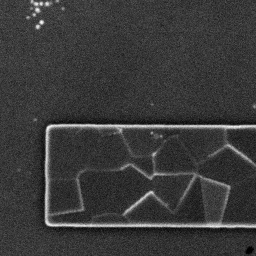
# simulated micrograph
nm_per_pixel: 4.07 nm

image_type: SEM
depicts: wiring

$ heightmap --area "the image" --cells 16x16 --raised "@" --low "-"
----------------
----------------
----------------
----------------
----------------
----------------
----------------
----------------
---@@@@@@@@@@@@@
---@@@@@@@@@@@@@
---@@@@@@@@@@@@@
---@@@@@@@@@@@@@
---@@@@@@@@@@@@@
---@@@@@@@@@@@@@
----------------
----------------